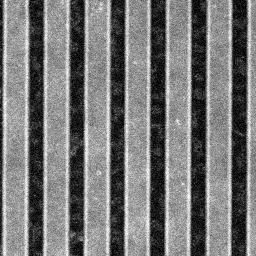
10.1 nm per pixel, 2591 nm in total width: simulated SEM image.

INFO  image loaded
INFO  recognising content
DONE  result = parallel lines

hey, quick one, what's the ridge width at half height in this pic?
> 230 nanometres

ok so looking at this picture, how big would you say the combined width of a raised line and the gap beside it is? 412 nm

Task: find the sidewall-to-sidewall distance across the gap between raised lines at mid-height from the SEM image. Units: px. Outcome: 17.9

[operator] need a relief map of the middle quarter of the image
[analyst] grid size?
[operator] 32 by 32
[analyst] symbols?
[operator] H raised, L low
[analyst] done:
HLLLLLHHHHHLLLLLHHHHHLLLLLHHHHHL
HLLLLLHHHHHLLLLLHHHHHLLLLLHHHHHL
HLLLLLHHHHHLLLLLHHHHHLLLLLHHHHHL
HLLLLLHHHHHLLLLLHHHHHLLLLLHHHHHL
HLLLLLHHHHHLLLLLHHHHHLLLLLHHHHHL
HLLLLLHHHHHLLLLLHHHHHLLLLLHHHHHL
HLLLLLHHHHHLLLLLHHHHHLLLLLHHHHHL
HLLLLLHHHHHLLLLLHHHHHLLLLLHHHHHL
HLLLLLHHHHHLLLLLHHHHHLLLLLHHHHHL
HLLLLHHHHHHLLLLLHHHHHLLLLLHHHHHL
HLLLLLHHHHHLLLLLHHHHHLLLLLHHHHHL
HLLLLLHHHHHLLLLLHHHHHLLLLLHHHHHL
HLLLLLHHHHHLLLLLHHHHHLLLLLHHHHHL
HLLLLLHHHHHLLLLLHHHHHLLLLLHHHHHL
HLLLLLHHHHHLLLLLHHHHHLLLLLHHHHHL
HLLLLLHHHHHLLLLLHHHHHLLLLLHHHHHL
HLLLLLHHHHHLLLLLHHHHHLLLLLHHHHHL
HLLLLLHHHHHLLLLLHHHHHLLLLLHHHHHL
HLLLLLHHHHHLLLLLHHHHHLLLLLHHHHHL
HLLLLLHHHHHLLLLLHHHHHLLLLLHHHHHL
HLLLLLHHHHHLLLLLHHHHHLLLLLHHHHHL
HLLLLLHHHHHLLLLLHHHHHLLLLLHHHHHL
HLLLLLHHHHHLLLLLHHHHHLLLLLHHHHHL
HLLLLLHHHHHLLLLLHHHHHLLLLLHHHHHL
HLLLLLHHHHHLLLLLHHHHHLLLLLHHHHHL
HLLLLLHHHHHLLLLLHHHHHLLLLLHHHHHL
HLLLLLHHHHHLLLLLHHHHHLLLLLHHHHHL
HLLLLLHHHHHLLLLLHHHHHLLLLLHHHHHL
HLLLLLHHHHHLLLLLHHHHHLLLLLHHHHHL
HLLLLLHHHHHLLLLLHHHHHLLLLLHHHHHL
HLLLLLHHHHHLLLLLHHHHHLLLLLHHHHHL
HLLLLLHHHHHLLLLLHHHHHLLLLLHHHHHL